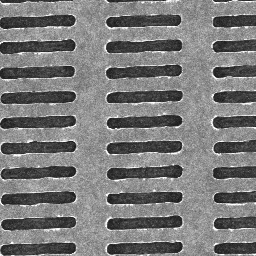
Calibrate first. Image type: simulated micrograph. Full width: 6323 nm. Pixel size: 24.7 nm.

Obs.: a regular array of holes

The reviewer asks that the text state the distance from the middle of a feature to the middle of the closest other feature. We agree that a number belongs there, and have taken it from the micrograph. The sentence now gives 620 nanometres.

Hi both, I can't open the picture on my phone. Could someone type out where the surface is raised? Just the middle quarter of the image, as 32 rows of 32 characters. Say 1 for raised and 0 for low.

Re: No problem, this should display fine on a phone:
00111111111111111100000010000111
00011111111000000000000000000011
00111111110000000000000000000111
11111111111000000000000111111111
11111111111111111111111111111111
11111111111111111111111111111111
11111111111111111111111000000111
00011111111000000000000000000011
00011111111000000000000000000011
00111111111000000000110001111111
11111111111111111111111111111111
11111111111111111111111111111111
11111111111111111111111111111111
00011111111000000000000000000111
00011111111000000000000000000111
00011111111000000000000000001111
11111111111111111111111111111111
11111111111111111111111111111111
11111111111111111111111111111111
00011111111110000000000000000111
00011111111000000000000000000011
00011111111000000000000000000111
11111111111100000001111111111111
11111111111111111111111111111111
11111111111111111111111111111111
00111111111111111111111111000111
00011111111000000000000000000011
00011111111000000000000000000011
01111111111000000000000111101111
11111111111111111111111111111111
11111111111111111111111111111111
11111111111111111111111111111111